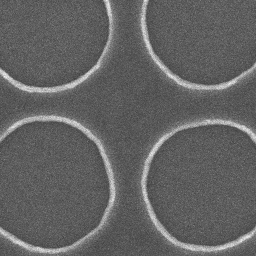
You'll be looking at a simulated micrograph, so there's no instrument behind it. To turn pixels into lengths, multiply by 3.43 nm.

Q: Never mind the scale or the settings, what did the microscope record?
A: holes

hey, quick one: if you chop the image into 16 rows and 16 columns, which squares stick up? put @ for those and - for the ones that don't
-------@@-------
-------@@-------
-------@@-------
------@@@@------
-----@@@@@@----@
@@@@@@@@@@@@@@@@
@@@@@@@@@@@@@@@@
@@-@@@@@@@@@@@@@
------@@@@@-----
------@@@@------
-------@@-------
-------@@-------
-------@@-------
-------@@@------
------@@@@------
@@@-@@@@@@@@@@@@